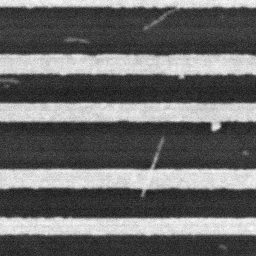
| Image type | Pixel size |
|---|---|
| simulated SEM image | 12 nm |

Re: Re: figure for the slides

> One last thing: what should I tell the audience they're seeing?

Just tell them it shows lines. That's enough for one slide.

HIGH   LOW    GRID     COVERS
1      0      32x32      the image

11111111111111111111111111111111
00000000000000000000000000000000
00000000000000000000000000000000
00000000000000000000000000000000
00000000000000000000000000000000
00000000000000000000000000000000
00000000000000000000000000000000
11111111111111111111111111111111
11111111111111111111111111111111
00000000000000000000000000000000
00000000000000000000000000000000
00000000000000000000000000000000
00000000000000000000000000000000
11111111111111111111111111111111
11111111111111111111111111111111
00000000000000000000000000000000
00000000000000000000000000000000
00000000000000000000000000000000
00000000000000000000000000000000
00000000000000000000000000000000
00000000000000000000000000000000
11111111111111111111111111111111
11111111111111111111111111111111
00000000000000000110000000100000
00000000000000000000000000000000
00000000000000000000000000000000
00000000000000000000000000000000
11111111111111111111111111111111
11111111111111111111111111111111
00000000000000000000000000000000
00000000000000000000000000000000
00000000000000000000000000000000